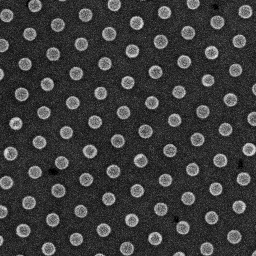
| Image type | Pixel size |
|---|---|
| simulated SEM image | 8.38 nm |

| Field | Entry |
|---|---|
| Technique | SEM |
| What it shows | a regular array of raised bodies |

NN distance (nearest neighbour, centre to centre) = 242 nm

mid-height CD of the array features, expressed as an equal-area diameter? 106 nm